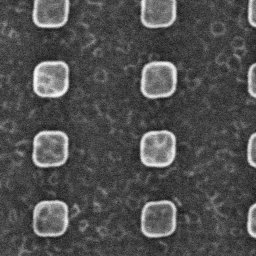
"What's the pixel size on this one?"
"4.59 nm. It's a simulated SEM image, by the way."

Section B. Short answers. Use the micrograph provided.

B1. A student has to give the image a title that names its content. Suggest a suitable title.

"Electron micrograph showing raised bodies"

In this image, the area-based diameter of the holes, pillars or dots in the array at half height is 36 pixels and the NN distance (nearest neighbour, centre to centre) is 319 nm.